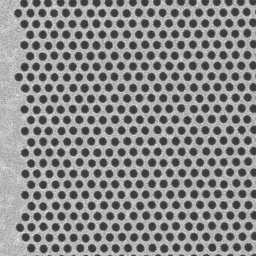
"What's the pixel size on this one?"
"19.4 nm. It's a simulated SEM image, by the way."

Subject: a regular array of holes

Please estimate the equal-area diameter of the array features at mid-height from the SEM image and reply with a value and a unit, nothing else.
160 nm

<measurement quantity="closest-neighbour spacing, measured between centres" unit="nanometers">224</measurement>